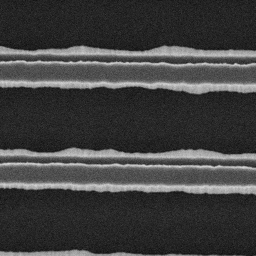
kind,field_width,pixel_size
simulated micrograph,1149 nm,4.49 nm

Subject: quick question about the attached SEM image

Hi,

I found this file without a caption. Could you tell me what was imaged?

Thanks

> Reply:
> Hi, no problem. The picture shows lines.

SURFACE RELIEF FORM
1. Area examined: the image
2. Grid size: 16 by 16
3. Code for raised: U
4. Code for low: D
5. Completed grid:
DDDDDDDDDDDDDDDD
DDDDDDDDDDDDDDDD
DDDDDDDDDDDDDDDD
UUUUUUUUUUUUUUUU
UUUUUUUUUUUUUUUU
DDDDDDDDDDDDDDDD
DDDDDDDDDDDDDDDD
DDDDDDDDDDDDDDDD
DDDDDDDDDDDDDDDD
DDDDDDDDDDDDDDDD
UUUUUUUUUUUUUUUU
UUUUUUUUUUUUUUUU
DDDDDDDDDDDDDDDD
DDDDDDDDDDDDDDDD
DDDDDDDDDDDDDDDD
DDDDDDDDDDDDDDDD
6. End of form